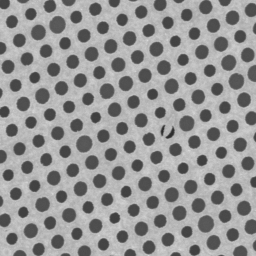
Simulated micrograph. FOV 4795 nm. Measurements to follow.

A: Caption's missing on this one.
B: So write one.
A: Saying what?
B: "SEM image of a regular array of holes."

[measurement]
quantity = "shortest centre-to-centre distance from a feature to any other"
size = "20 px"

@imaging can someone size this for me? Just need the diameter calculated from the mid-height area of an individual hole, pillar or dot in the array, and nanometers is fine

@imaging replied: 245